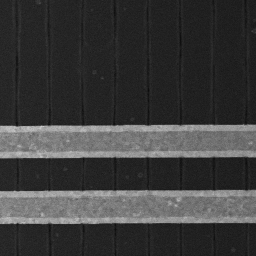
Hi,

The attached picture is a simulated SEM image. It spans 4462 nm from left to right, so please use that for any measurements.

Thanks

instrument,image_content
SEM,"wiring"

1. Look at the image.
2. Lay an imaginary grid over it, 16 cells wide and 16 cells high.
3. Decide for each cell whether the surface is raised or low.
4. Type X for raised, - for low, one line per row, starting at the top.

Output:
----------------
----------------
----------------
----------------
----------------
----------------
----------------
----------------
XXXXXXXXXXXXXXXX
XXXXXXXXXXXXXXXX
----------------
----------------
XXXXXXXXXXXXXXXX
XXXXXXXXXXXXXXXX
----------------
----------------